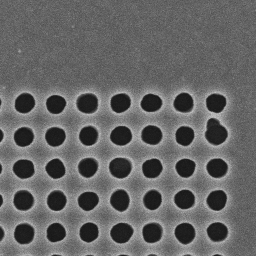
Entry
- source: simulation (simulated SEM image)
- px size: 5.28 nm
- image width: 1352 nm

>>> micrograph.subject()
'a regular array of holes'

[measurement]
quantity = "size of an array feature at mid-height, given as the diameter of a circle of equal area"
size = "0.104 µm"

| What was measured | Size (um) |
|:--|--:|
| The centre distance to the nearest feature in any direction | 0.165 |